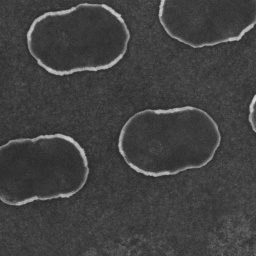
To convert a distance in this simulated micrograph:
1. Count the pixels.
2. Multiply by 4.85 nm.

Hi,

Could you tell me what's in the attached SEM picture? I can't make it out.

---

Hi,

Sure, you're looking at raised bodies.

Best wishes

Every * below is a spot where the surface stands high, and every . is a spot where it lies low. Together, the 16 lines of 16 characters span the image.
....***...******
..******..******
..******...****.
..******........
...**...........
................
................
........*****...
...*....******..
*****...*****...
*****...****....
*****...........
**..............
................
................
................